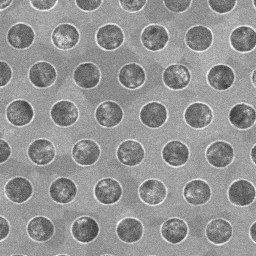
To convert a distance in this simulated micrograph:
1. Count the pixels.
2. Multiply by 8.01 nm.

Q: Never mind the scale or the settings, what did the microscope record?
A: a regular array of holes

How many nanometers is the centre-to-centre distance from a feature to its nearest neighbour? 355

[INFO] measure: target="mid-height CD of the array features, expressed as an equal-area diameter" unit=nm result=214